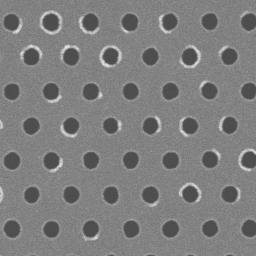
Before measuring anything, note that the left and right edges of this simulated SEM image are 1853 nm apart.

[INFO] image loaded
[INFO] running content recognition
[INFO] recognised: a regular array of holes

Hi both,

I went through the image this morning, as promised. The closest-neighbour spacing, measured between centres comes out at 285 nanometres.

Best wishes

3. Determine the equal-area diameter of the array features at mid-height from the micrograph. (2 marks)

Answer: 0.119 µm